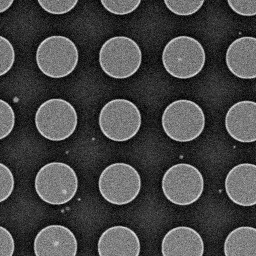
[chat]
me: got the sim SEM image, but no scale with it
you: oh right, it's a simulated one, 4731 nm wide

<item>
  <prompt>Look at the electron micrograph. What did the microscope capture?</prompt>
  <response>an array of small figures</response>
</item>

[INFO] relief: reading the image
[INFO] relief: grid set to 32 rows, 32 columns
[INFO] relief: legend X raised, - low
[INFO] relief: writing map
X----XXXX----XXXX----XXXX----XXX
------XX------XX------XX------XX
--------------------------------
--------------------------------
--------------------------------
X----XXXX----XXXX----XXXX----XXX
XX---XXXXX---XXXXX---XXXXX--XXXX
XX---XXXXX---XXXXX--XXXXXX--XXXX
X----XXXX----XXXX----XXXX----XXX
------XX------XX------XX------XX
--------------------------------
--------------------------------
------XX------------------------
X----XXXX----XXXX----XXXX----XXX
XX---XXXXX--XXXXX---XXXXX---XXXX
XX--XXXXXX--XXXXX---XXXXX---XXXX
X----XXXX----XXXX----XXXX----XXX
--------------XX------XX------XX
--------------------------------
--------------------------------
------XX------XX--------------X-
X----XXXX----XXXX----XXXX----XXX
XX--XXXXXX--XXXXX---XXXXX---XXXX
XX---XXXXX--XXXXX---XXXXX---XXXX
X----XXXX----XXXX----XXXX----XXX
--------------X-------X-------XX
--------------------------------
--------------------------------
------XX------XX------X-------XX
X----XXXX----XXXX----XXXX----XXX
XX--XXXXXX--XXXXX---XXXXX---XXXX
XX--XXXXXX--XXXXX---XXXXX---XXXX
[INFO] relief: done